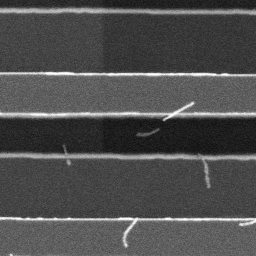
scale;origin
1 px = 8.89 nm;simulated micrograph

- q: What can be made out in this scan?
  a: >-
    lines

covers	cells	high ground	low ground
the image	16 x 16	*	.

................
****************
****************
****************
****************
****************
****************
................
................
................
****************
****************
****************
****************
****************
****************